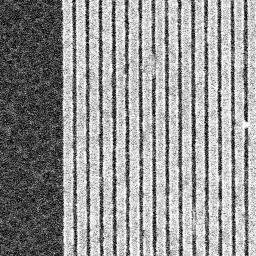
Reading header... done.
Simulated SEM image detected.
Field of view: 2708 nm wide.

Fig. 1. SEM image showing parallel lines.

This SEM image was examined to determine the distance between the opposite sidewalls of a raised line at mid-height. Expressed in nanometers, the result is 91.2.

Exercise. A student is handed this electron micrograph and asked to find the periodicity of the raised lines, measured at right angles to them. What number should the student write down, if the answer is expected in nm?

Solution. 140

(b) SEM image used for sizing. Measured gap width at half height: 48.9 nm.